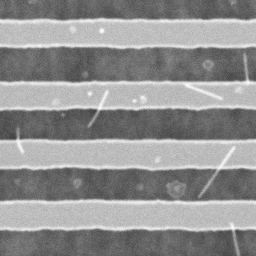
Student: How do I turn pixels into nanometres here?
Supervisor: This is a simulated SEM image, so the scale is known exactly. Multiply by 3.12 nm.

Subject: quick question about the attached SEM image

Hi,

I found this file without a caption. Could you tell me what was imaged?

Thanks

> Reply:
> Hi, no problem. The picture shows lines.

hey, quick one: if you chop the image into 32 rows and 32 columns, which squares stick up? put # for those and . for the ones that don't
................................
................................
....###...#########.#.....####.#
################################
################################
################################
................................
................................
................................
................................
################################
################################
################################
##########################..####
................................
................................
................................
..####......####..####.........#
################################
################################
################################
................................
................................
................................
................................
################################
################################
################################
################################
................................
................................
................................